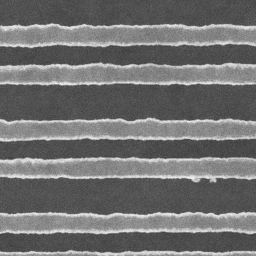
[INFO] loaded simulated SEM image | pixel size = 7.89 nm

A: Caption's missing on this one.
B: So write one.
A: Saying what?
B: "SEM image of lines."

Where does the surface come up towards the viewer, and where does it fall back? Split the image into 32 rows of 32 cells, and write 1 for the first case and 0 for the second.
00000000000000000000000000000000
00000000000000000000000000000000
00000000000000000000000000000000
11111111111111111111111111111111
11111111111111111111111111111111
11111110111111111110111111100001
00000000000000000000000000000000
00000000000000000000000000000000
11111111111111111111111111111111
11111111111111111111111111111111
00010101111000000000100100000100
00000000000000000000000000000000
00000000000000000000000000000000
00000000000000000000000000000000
00000000000000000000000000000000
11111111111111111111111111111111
11111111111111111111111111111111
11000000000000000000000000000000
00000000000000000000000000000000
00000000000000000000000000000000
11111111111111111111111111111111
11111111111111111111111111111111
00000000000000000000000000000000
00000000000000000000000000000000
00000000000000000000000000000000
00000000000000000000000000000000
00000000000000000000000000000000
11111111111111111111111111111111
11111111111111111111111111111111
00000000000000000000000000000000
00000000000000000000000000000000
00001000111000000111110110000111